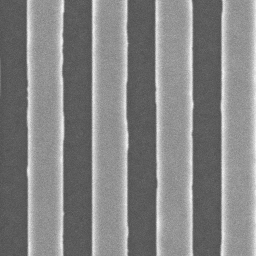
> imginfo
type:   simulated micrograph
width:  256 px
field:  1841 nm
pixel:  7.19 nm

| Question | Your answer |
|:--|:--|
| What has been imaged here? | lines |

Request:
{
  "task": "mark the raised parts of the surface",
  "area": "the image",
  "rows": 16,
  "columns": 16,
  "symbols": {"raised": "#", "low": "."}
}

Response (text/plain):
..##..##..##..##
..##..##..##..##
..##..##..##..##
..##..##..##..##
..##..##..##..##
..##..##..##..##
..##..##..##..##
..##..##..##..##
..##..##..##..##
..##..##..##..##
..##..##..##..##
..##..##..##..##
..##..##..##..##
..##..##..##..##
..##..##..##..##
..##..##..##..##